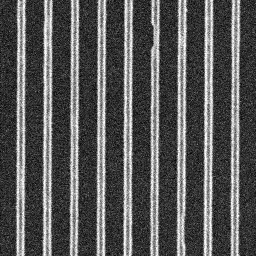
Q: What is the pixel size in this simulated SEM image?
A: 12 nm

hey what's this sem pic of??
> parallel lines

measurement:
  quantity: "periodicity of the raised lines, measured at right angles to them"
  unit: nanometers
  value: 322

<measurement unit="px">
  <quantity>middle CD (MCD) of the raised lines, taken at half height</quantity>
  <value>6.37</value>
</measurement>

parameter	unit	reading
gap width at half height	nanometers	244